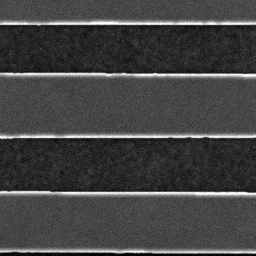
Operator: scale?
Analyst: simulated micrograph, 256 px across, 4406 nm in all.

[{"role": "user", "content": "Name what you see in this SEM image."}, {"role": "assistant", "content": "lines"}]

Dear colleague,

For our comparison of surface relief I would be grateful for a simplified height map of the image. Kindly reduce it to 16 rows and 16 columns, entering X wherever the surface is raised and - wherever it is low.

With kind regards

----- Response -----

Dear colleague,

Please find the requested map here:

XXXXXXXXXXXXXXXX
XXXXXX-XXXXXXXXX
----------------
----------------
----------------
XXXXXXXXXXXXXXXX
XXXXXXXXXXXXXXXX
XXXXXXXXXXXXXXXX
XXXXXXXXXXXXXXXX
----------------
----------------
----------------
XXXXXXXXXXXXXXXX
XXXXXXXXXXXXXXXX
XXXXXXXXXXXXXXXX
XXXXXXXXXXXXXXXX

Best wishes